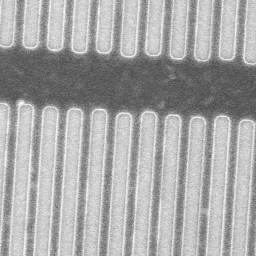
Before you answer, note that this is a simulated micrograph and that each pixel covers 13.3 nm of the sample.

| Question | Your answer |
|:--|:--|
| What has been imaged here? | parallel lines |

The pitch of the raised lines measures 0.327 µm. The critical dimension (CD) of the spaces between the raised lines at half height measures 186 nanometres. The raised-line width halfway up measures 140 nm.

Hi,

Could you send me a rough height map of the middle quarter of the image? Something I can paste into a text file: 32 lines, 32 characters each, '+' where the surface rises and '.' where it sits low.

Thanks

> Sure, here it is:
++++++++++++++++++++++++++++++++
++++++++++++++++++++++++++++++++
++++++++++++++++++++++++++++++++
++++++++++++++++++++++++++++++++
++++++++++++++++++++++++++++++++
++++++++++++++++++++++++++++++++
++++++++++++++++++++++++++++++++
++++++++++++++++++++++++++++++++
++++++++++++++++++++++++++++++++
++++++++++++++++++++++++++++++++
++++++++++++++++++++++++++++++++
++..++++..++++++++++++++++++++++
+...+++....+++..++++...+++++++++
+....++....++....++....+++...+++
+...+++....++....++....++....+++
+...+++...+++....++....++....+++
+...+++...+++....++....++....+++
+...+++...+++....++....++....++.
....+++...+++....++....++....++.
....+++...+++....++....++....++.
....++....+++...+++....++....++.
....++....+++...+++....++....++.
....++....+++...+++...+++....++.
....++....+++...+++...+++...+++.
....++....++....+++...+++...+++.
....++....++....+++...+++...+++.
....++....++....++....+++...+++.
....++....++....++....+++...+++.
....++....++....++....++....+++.
...+++....++....++....++....+++.
...+++....++....++....++....+++.
...+++...+++....++....++....+++.